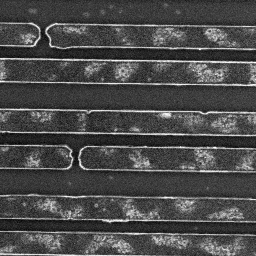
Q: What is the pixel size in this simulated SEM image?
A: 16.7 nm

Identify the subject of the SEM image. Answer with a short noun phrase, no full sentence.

parallel lines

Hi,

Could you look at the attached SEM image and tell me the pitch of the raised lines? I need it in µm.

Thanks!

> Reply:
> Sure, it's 0.713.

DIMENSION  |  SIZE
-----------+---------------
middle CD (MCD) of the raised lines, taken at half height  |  380 nanometres